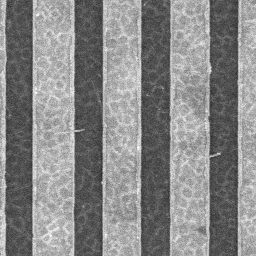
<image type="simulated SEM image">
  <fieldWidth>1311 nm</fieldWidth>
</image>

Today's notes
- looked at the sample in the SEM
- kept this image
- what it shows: one or a few lines or trenches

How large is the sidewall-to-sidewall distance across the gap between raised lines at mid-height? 152 nm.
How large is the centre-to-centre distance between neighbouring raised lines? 349 nanometres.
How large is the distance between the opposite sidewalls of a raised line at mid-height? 197 nm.